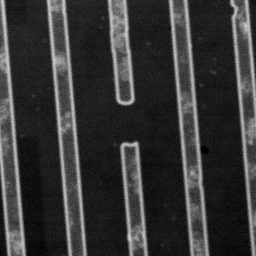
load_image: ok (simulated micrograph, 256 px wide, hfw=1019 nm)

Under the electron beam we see parallel lines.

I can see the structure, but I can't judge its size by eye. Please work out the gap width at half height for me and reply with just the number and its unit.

181 nm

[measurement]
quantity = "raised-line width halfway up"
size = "0.0604 micrometres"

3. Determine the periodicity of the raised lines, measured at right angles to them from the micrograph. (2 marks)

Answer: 242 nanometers